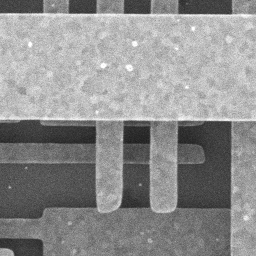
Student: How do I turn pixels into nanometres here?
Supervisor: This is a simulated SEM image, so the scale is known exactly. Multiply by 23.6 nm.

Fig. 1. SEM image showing wiring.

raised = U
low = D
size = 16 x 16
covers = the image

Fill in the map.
DDDDDDDDDDDDDDDD
UUUUUUUUUUUUUUUU
UUUUUUUUUUUUUUUU
UUUUUUUUUUUUUUUU
UUUUUUUUUUUUUUUU
UUUUUUUUUUUUUUUU
UUUUUUUUUUUUUUUU
DDDDDDDDDDDDDDUU
DDDDDDDDDDDDDDDD
DDDDDDDDDDDDDDDD
DDDDDDDDDDDDDDDD
DDDDDDDDDDDDDDDD
DDDDDDDDDDDDDDDD
DDDDDDDDDDDDDDDD
DDDDDDDDDDDDDDDD
DDDDDDDDDDDDDDDD